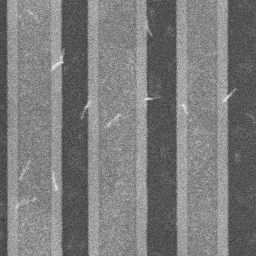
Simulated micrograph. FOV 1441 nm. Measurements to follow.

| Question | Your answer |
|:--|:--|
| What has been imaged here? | one or a few lines or trenches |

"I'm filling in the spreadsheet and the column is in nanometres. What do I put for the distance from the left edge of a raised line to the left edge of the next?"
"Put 472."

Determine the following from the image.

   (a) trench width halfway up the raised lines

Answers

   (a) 0.212 um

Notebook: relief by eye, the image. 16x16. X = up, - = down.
-XXX--XXX--XXX--
-XXX--XXX--XXX--
-XXX--XXX--XXX--
-XXX--XXX--XXX--
-XXX--XXX--XXX--
-XXX--XXX--XXX--
-XXX--XXX--XXX--
-XXX--XXX--XXX--
-XXX--XXX--XXX--
-XXX--XXX--XXX--
-XXX--XXX--XXX--
-XXX--XXX--XXX--
-XXX--XXX--XXX--
-XXX--XXX--XXX--
-XXX--XXX--XXX--
-XXX--XXX--XXX--